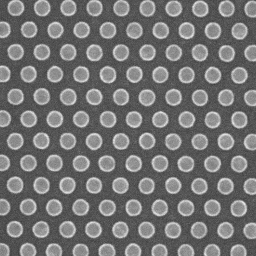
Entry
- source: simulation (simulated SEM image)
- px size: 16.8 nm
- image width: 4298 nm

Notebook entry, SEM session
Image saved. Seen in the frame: a regular array of raised bodies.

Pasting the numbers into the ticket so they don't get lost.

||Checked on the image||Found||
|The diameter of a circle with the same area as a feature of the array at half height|0.262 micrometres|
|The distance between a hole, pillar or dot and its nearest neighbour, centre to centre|427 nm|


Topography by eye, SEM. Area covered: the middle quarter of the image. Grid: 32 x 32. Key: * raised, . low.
................................
...***....**....***....**....***
...***...****...***...****...***
...***...****...***...****...***
..........**.....*.....**.....*.
................................
*......*......*............*....
***...***....***...****...***...
***...***....***...****...***...
***...***....***...***....***...
................................
................................
...***....**....***....**....***
...***...****...***...****...***
...***...****...***...****...***
....*.....**....***....**.....**
................................
*...................*...........
***...***....***...***....***...
***...***....***...****...***...
**....***....***...***....***...
................................
................................
...***...***....***....**....***
..****...****...***...****...***
..****...****...***...****...***
....*.....**....***....**....***
................................
................................
***...***...****...***....***...
***...***...****...***....***...
**....***....***...***....***...